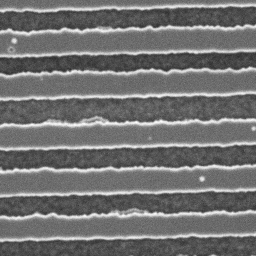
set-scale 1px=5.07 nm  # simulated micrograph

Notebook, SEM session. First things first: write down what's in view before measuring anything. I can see lines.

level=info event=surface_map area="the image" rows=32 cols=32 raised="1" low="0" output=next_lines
11111111111111111111111111111111
00000100000000000000000000000000
00000000000000000000000000000000
00000000000000001010111111111111
11111111111111111111111111111111
11111111111111111111111111111111
11111111111111111111111111111100
00000000000000000000000000000000
00000000000000000000000000000001
11111111111111111111111111111111
11111111111111111111111111111111
11111111111111111111111111111111
11100000000000000000000000000000
00000000000000000000000000000000
00000000000000000000000000000000
00000111101111111111111111111111
11111111111111111111111111111111
11111111111111111111111111111111
11111111111111000000000000000000
00000000000000000000000000000000
00000000000000000000000000000000
11111111111111111111111111111111
11111111111111111111111111111111
11111111111111111111111111111111
11000000000000000000000000000000
00000000000000000000000000000000
00000000000000000000000000111111
11111111111111111111111111111111
11111111111111111111111111111111
11111111111111111111111111110010
00000000000000000000000000000000
00000000000000000000000000000000